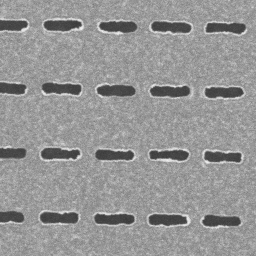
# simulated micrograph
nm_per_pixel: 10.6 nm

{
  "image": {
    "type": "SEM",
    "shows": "a regular array of holes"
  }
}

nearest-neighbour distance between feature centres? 568 nm